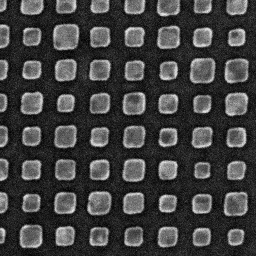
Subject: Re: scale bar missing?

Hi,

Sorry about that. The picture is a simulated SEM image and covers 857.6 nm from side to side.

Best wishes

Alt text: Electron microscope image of a regular array of raised bodies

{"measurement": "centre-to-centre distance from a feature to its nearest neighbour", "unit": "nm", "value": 111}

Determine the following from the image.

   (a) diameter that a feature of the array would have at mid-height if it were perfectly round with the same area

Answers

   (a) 65.7 nanometers